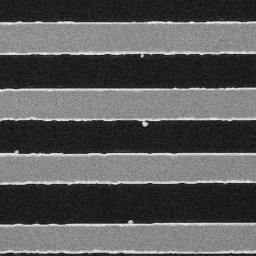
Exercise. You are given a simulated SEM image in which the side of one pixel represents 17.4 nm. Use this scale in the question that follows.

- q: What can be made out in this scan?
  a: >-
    lines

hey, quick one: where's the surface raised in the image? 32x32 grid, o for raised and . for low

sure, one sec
................................
................................
................................
oooooooooooooooooooooooooooooooo
oooooooooooooooooooooooooooooooo
oooooooooooooooooooooooooooooooo
oooooooooooooooooooooooooooooooo
................................
................................
................................
................................
oooooooooooooooooooooooooooooooo
oooooooooooooooooooooooooooooooo
oooooooooooooooooooooooooooooooo
oooooooooooooooooooooooooooooooo
................................
................................
................................
................................
oooooooooooooooooooooooooooooooo
oooooooooooooooooooooooooooooooo
oooooooooooooooooooooooooooooooo
oooooooooooooooooooooooooooooooo
................................
................................
................................
................................
................................
oooooooooooooooooooooooooooooooo
oooooooooooooooooooooooooooooooo
oooooooooooooooooooooooooooooooo
oooooooooooooooooooooooooooooooo